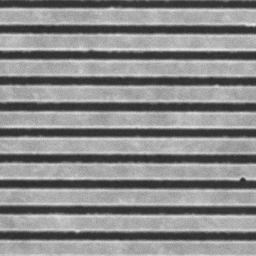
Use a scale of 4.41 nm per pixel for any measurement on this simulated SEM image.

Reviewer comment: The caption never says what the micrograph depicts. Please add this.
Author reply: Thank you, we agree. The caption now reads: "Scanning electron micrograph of parallel lines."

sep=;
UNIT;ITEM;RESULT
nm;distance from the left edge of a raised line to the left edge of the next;114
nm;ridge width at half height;72.7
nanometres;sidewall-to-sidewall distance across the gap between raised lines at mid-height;42.4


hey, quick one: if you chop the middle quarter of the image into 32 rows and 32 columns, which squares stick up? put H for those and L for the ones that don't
HHHHHHHHHHHHHHHHHHHHHHHHHHHHHHHH
HHHHHHHHHHHHHHHHHHHHHHHHHHHHHHHH
HHHHHHHHHHHHHHHHHHHHHHHHHHHHHHHH
LLLLLLLLLLLLLLLLLLLLLLLLLLLLLLLL
LLLLLLLLLLLLLLLLLLLLLLLLLLLLLLLL
LLLLLLLLLLLLLLLLLLLLLLLLLLLLLLLL
HHHHHHHHHHHHHHHHHHHHHHHHHHHHHHHH
HHHHHHHHHHHHHHHHHHHHHHHHHHHHHHHH
HHHHHHHHHHHHHHHHHHHHHHHHHHHHHHHH
LLLLLLLLLLLLLLLLLLLLLLLLLLLLLLHH
LLLLLLLLLLLLLLLLLLLLLLLLLLLLLLLL
LLLLLLLLLLLLLLLLLLLLLLLLLLLLLLLL
HHHHHHHHHHHHHHHHHHHHHHHHHHHHHHHH
HHHHHHHHHHHHHHHHHHHHHHHHHHHHHHHH
HHHHHHHHHHHHHHHHHHHHHHHHHHHHHHHH
HHHHHHHHHHHHHHHHHHHHHHHHHHHHHHHH
LLLLLLLLLLLLLLLLLLLLLLLLLLLLLLLL
LLLLLLLLLLLLLLLLLLLLLLLLLLLLLLLL
HHHHHHHHLHHHHHHHHHHHHHHLHHLHHHHH
HHHHHHHHHHHHHHHHHHHHHHHHHHHHHHHH
HHHHHHHHHHHHHHHHHHHHHHHHHHHHHHHH
HHHHHHHHHHHHHHHHHHHHHHHHHHHHHHHH
LLLLLLLLLLLLLLLLLLLLLLLLLLLLLLLL
LLLLLLLLLLLLLLLLLLLLLLLLLLLLLLLL
LLLLLLLLLLLLLLLLLLLLLLLLLLLLLLLL
HHHHHHHHHHHHHHHHHHHHHHHHHHHHHHHH
HHHHHHHHHHHHHHHHHHHHHHHHHHHHHHHH
HHHHHHHHHHHHHHHHHHHHHHHHHHHHHHHH
HHHHHHHHHHHHHHHHHHHHHHHHHHHHHHHH
LLLLLLLLLLLLLLLLLLLLLLLLLLLLLLLL
LLLLLLLLLLLLLLLLLLLLLLLLLLLLLLLL
HHHHHHHLHHHLLLLHLHHHHHLLHHLLHHLL